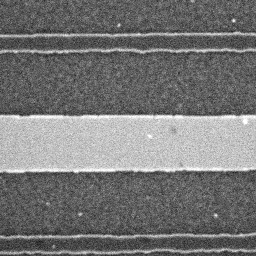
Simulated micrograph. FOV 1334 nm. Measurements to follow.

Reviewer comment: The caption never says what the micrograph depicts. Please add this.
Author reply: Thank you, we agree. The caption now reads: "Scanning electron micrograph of lines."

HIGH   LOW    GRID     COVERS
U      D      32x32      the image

DDDDDDDDDDDDDDDDDDDDDDDDDDDDDDDD
DDDDDDDDDDDDDDDDDDDDDDDDDDDDDDDD
DDDDDDDDDDDDDDDDDDDDDDDDDDDDDDDD
DDDDDDDDDDDDDDDDDDDDDDDDDDDDDDDD
UUUUUUUUUUUUUUUUUUUUUUUUUUUUUUUU
UUUUUUUUUUUUUUUUUUUUUUUUUUUUUUUU
UUUDUUUUUDDDDDDDDUDDDDDDDDDDDDDD
DDDDDDDDDDDDDDDDDDDDDDDDDDDDDDDD
DDDDDDDDDDDDDDDDDDDDDDDDDDDDDDDD
DDDDDDDDDDDDDDDDDDDDDDDDDDDDDDDD
DDDDDDDDDDDDDDDDDDDDDDDDDDDDDDDD
DDDDDDDDDDDDDDDDDDDDDDDDDDDDDDDD
DDDDDDDDDDDDDDDDDDDDDDDDDDDDDDDD
DDDDDDDDDDDDDDDDDDDDDDDDDDDDDDDD
UUDDUUUDDDUDUUUUUUDUUDDDDDDDUDUU
UUUUUUUUUUUUUUUUUUUUUUUUUUUUUUUU
UUUUUUUUUUUUUUUUUUUUUUUUUUUUUUUU
UUUUUUUUUUUUUUUUUUUUUUUUUUUUUUUU
UUUUUUUUUUUUUUUUUUUUUUUUUUUUUUUU
UUUUUUUUUUUUUUUUUUUUUUUUUUUUUUUU
UUUUUUUUUUUUUUUUUUUUUUUUUUUUUUUU
DDDDDDDDDDDDDDDDDDDDDDDDDDDDDDDD
DDDDDDDDDDDDDDDDDDDDDDDDDDDDDDDD
DDDDDDDDDDDDDDDDDDDDDDDDDDDDDDDD
DDDDDDDDDDDDDDDDDDDDDDDDDDDDDDDD
DDDDDDDDDDDDDDDDDDDDDDDDDDDDDDDD
DDDDDDDDDDDDDDDDDDDDDDDDDDDDDDDD
DDDDDDDDDDDDDDDDDDDDDDDDDDDDDDDD
DDDDDDDDDDDDDDDDDDDDDDDDDDDDDDDD
DDDDDUUDDUUUUUDDUUUUUUUUUUUUUUUU
UUUUUUUUUUUUUUUUUUUUUUUUUUUUUUUU
UUUUUUUUUUUUUUUUUUUDDDUUDDDDDDDD